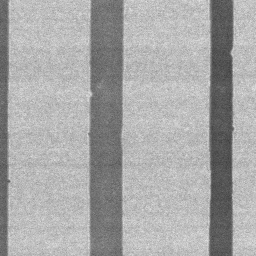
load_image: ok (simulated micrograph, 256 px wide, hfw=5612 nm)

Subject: one or a few lines or trenches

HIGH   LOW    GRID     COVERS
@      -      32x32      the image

-@@@@@@@@@@----@@@@@@@@@@@---@@@
-@@@@@@@@@@----@@@@@@@@@@@---@@@
-@@@@@@@@@@----@@@@@@@@@@@---@@@
-@@@@@@@@@@----@@@@@@@@@@@---@@@
-@@@@@@@@@@----@@@@@@@@@@@---@@@
-@@@@@@@@@@----@@@@@@@@@@@---@@@
-@@@@@@@@@@----@@@@@@@@@@@---@@@
-@@@@@@@@@@----@@@@@@@@@@@---@@@
-@@@@@@@@@@----@@@@@@@@@@@---@@@
-@@@@@@@@@@----@@@@@@@@@@@---@@@
-@@@@@@@@@@----@@@@@@@@@@@---@@@
-@@@@@@@@@@----@@@@@@@@@@@---@@@
-@@@@@@@@@@----@@@@@@@@@@@---@@@
-@@@@@@@@@@----@@@@@@@@@@@---@@@
-@@@@@@@@@@----@@@@@@@@@@@---@@@
-@@@@@@@@@@----@@@@@@@@@@@---@@@
-@@@@@@@@@@----@@@@@@@@@@@---@@@
-@@@@@@@@@@----@@@@@@@@@@@---@@@
-@@@@@@@@@@----@@@@@@@@@@@---@@@
-@@@@@@@@@@----@@@@@@@@@@@---@@@
-@@@@@@@@@@----@@@@@@@@@@@---@@@
-@@@@@@@@@@----@@@@@@@@@@@---@@@
-@@@@@@@@@@----@@@@@@@@@@@---@@@
-@@@@@@@@@@----@@@@@@@@@@@---@@@
-@@@@@@@@@@----@@@@@@@@@@@---@@@
-@@@@@@@@@@----@@@@@@@@@@@---@@@
-@@@@@@@@@@----@@@@@@@@@@@---@@@
-@@@@@@@@@@----@@@@@@@@@@@---@@@
-@@@@@@@@@@----@@@@@@@@@@@---@@@
-@@@@@@@@@@----@@@@@@@@@@@---@@@
-@@@@@@@@@@----@@@@@@@@@@@---@@@
-@@@@@@@@@@----@@@@@@@@@@@---@@@